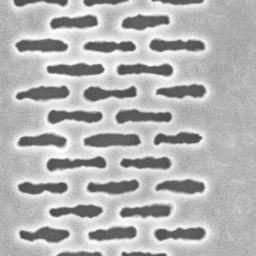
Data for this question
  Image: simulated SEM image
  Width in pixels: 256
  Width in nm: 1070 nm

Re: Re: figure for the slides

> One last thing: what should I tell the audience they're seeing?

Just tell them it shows a regular array of holes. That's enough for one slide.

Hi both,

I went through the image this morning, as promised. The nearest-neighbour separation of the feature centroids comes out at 39.6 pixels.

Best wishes